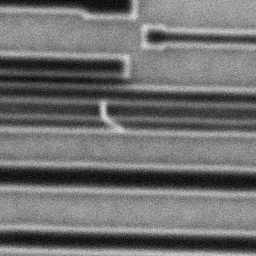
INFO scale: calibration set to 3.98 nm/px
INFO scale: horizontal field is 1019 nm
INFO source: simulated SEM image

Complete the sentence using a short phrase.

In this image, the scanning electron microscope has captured groups of lines, slits or small figures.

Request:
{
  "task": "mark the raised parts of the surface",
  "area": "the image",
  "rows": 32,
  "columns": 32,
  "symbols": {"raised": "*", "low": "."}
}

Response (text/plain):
*****************...............
.........********...............
................................
..................***...........
..................**************
..................**************
................................
****************................
****************................
.............***................
****............................
********************************
********************************
................................
*******.........................
********************************
.........***********************
................................
................................
................................
*************...................
********************************
********************************
********************************
................................
................................
................................
................................
********........................
********************************
********************************
....****************************